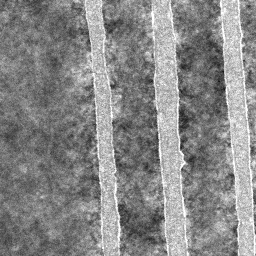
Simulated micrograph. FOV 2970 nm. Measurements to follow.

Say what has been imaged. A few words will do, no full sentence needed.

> one or a few lines or trenches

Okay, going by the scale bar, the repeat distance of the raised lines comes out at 780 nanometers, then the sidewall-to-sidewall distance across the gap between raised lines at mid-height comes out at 566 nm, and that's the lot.